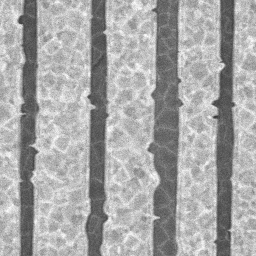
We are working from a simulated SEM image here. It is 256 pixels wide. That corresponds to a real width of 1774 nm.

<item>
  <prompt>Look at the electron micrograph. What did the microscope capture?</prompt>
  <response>one or a few lines or trenches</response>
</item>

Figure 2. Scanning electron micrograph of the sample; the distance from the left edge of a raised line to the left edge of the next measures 469 nanometres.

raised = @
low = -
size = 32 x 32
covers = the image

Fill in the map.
@@@--@@@@@@--@@@@@@---@@@@@--@@@
@@@--@@@@@@--@@@@@@---@@@@@---@@
@@---@@@@@@--@@@@@@---@@@@@--@@@
@@@--@@@@@@--@@@@@@---@@@@@--@@@
@@@--@@@@@@--@@@@@@---@@@@@--@@@
@@@--@@@@@@--@@@@@@---@@@@@--@@@
@@@--@@@@@@--@@@@@@---@@@@@--@@@
@@@--@@@@@@---@@@@@---@@@@@@-@@@
@@@--@@@@@@---@@@@@---@@@@@@-@@@
@@@--@@@@@@---@@@@@---@@@@@--@@@
@@@--@@@@@@---@@@@@----@@@@--@@@
@@---@@@@@@--@@@@@@----@@@@--@@@
@@@--@@@@@@---@@@@@----@@@@--@@@
@@@--@@@@@@--@@@@@@----@@@@--@@@
@@@--@@@@@@---@@@@@----@@@@--@@@
@@---@@@@@@--@@@@@@----@@@@--@@@
@@---@@@@@@--@@@@@@----@@@@--@@@
@@---@@@@@@--@@@@@@----@@@@--@@@
@@--@@@@@@@--@@@@@-----@@@@--@@@
@@---@@@@@@--@@@@@@---@@@@@--@@@
@@---@@@@@@--@@@@@@---@@@@@--@@@
@@--@@@@@@@--@@@@@@---@@@@@--@@@
@@--@@@@@@@--@@@@@@@--@@@@@--@@@
@@--@@@@@@@--@@@@@@---@@@@@--@@@
@@--@@@@@@@--@@@@@@---@@@@@--@@@
@@--@@@@@@@--@@@@@@---@@@@@--@@@
@@--@@@@@@@--@@@@@@---@@@@@--@@@
@@--@@@@@@@--@@@@@@---@@@@@--@@@
@@--@@@@@@@--@@@@@@---@@@@@--@@@
@@--@@@@@@@--@@@@@@---@@@@@--@@@
@@--@@@@@@@--@@@@@@---@@@@@--@@@
@@--@@@@@@@--@@@@@@---@@@@@--@@@